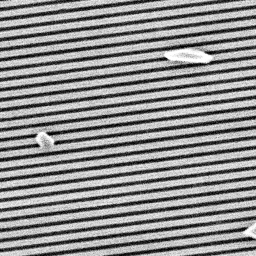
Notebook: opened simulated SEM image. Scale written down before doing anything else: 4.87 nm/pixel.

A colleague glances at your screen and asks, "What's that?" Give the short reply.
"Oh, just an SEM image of parallel lines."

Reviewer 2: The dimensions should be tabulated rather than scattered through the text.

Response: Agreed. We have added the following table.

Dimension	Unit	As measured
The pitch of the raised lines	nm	48.5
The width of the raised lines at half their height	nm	24.7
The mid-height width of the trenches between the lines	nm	20.5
